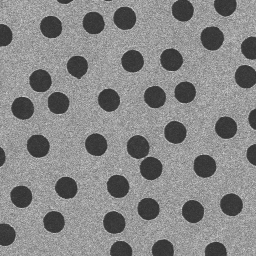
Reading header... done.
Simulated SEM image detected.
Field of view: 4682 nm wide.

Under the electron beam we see a regular array of holes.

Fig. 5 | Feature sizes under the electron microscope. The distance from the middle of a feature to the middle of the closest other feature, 0.671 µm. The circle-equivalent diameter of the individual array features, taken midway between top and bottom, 22.7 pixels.